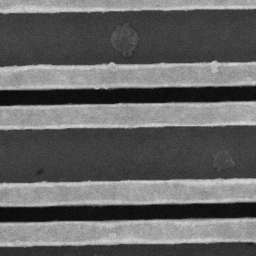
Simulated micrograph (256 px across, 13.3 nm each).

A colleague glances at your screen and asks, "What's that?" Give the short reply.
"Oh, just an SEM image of lines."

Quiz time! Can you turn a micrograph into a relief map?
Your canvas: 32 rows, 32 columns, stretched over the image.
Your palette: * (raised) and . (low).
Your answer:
********************************
***.............................
................................
................................
................................
................................
................................
................................
********************************
********************************
********************************
................................
................................
********************************
********************************
********************************
................................
................................
................................
................................
................................
................................
..............................**
********************************
********************************
******************..............
................................
...................*************
********************************
********************************
*************...................
................................